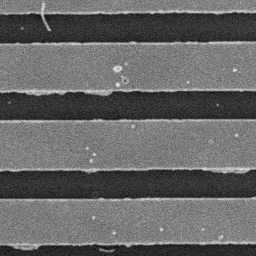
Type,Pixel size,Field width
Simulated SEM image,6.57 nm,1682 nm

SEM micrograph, lines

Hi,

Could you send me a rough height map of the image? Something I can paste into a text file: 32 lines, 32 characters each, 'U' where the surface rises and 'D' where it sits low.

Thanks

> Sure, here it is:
UUUUUUUUUUUUUUUUUUUUUUUUUUUUUUUU
UUUUUUUUUUUUUUUUUUUUUUUUUUUUUUUU
DDDDDDDDDDDDDDDDDDDDDDDDDDDDDDDD
DDDDDDDDDDDDDDDDDDDDDDDDDDDDDDDD
DDDDDDDDDDDDDDDDDDDDDDDDDDDDDDDD
DDUDUUUUUUUUUUUUUUUUUUUUUUUUUUUU
UUUUUUUUUUUUUUUUUUUUUUUUUUUUUUUU
UUUUUUUUUUUUUUUUUUUUUUUUUUUUUUUU
UUUUUUUUUUUUUUUUUUUUUUUUUUUUUUUU
UUUUUUUUUUUUUUUUUUUUUUUUUUUUUUUU
UUUUUUUUUUUUUUUUUUUUUUUUUUUUUUUU
UUUUDUUDDUDDDDDDDDDDDDDDDDDDDDDD
DDDDDDDDDDDDDDDDDDDDDDDDDDDDDDDD
DDDDDDDDDDDDDDDDDDDDDDDDDDDDDDDD
DDDDDDDDDDDDDDDDDDDDDDDDDDDDDDDD
UUUUUUUUUUUUUUUUUUUUUUUUUUUUUUUU
UUUUUUUUUUUUUUUUUUUUUUUUUUUUUUUU
UUUUUUUUUUUUUUUUUUUUUUUUUUUUUUUU
UUUUUUUUUUUUUUUUUUUUUUUUUUUUUUUU
UUUUUUUUUUUUUUUUUUUUUUUUUUUUUUUU
UUUUUUUUUUUUUUUUUUUUUUUUUUUUUUUU
DDDDDDDDDDDDDDDDDDDDDDDDDDDDDDDD
DDDDDDDDDDDDDDDDDDDDDDDDDDDDDDDD
DDDDDDDDDDDDDDDDDDDDDDDDDDDDDDDD
DDDDDDDDDDDDDDDDDDDDDDDDDDDDDDDD
UUUUUUUUUUUUUUUUUUUUUUUUUUUUUUUU
UUUUUUUUUUUUUUUUUUUUUUUUUUUUUUUU
UUUUUUUUUUUUUUUUUUUUUUUUUUUUUUUU
UUUUUUUUUUUUUUUUUUUUUUUUUUUUUUUU
UUUUUUUUUUUUUUUUUUUUUUUUUUUUUUUU
UUUUUUUUUUUUUUUUUUUUDDDDDUDDDDDD
DDDDDDDDDDDDDDDDDDDDDDDDDDDDDDDD